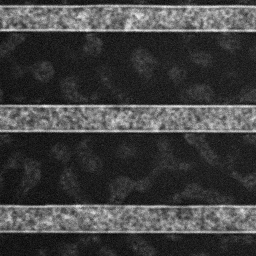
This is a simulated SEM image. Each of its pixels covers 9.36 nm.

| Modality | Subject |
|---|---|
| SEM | one or a few lines or trenches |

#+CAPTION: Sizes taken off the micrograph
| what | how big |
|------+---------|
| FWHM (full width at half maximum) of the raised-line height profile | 234 nanometers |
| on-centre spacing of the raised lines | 939 nm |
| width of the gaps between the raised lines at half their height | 709 nm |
